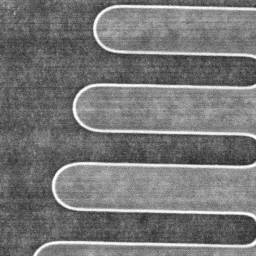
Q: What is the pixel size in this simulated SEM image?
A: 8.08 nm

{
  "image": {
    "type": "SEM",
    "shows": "groups of lines, slits or small figures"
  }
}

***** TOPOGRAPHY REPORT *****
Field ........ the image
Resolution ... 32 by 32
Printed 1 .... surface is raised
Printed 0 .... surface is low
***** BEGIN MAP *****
00000000000000000000000000000000
00000000000001111111111111111111
00000000000011111111111111111111
00000000000011111111111111111111
00000000000011111111111111111111
00000000000001111111111111111111
00000000000000011111111111111111
00000000000000000000000000000000
00000000000000000000000000000000
00000000000000000000000000000000
00000000000000000000000000000000
00000000001111111111111111111111
00000000011111111111111111111111
00000000011111111111111111111111
00000000011111111111111111111111
00000000001111111111111111111111
00000000000000000000011111111111
00000000000000000000000000000000
00000000000000000000000000000000
00000000000000000000000000000000
00000000011111000000000000000000
00000001111111111111111111111111
00000001111111111111111111111111
00000001111111111111111111111111
00000001111111111111111111111111
00000000111111111111111111111111
00000000000000000000000011111111
00000000000000000000000000000000
00000000000000000000000000000000
00000000000000000000000000000000
00000011111111111000000000000001
00000111111111111111111111111111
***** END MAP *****